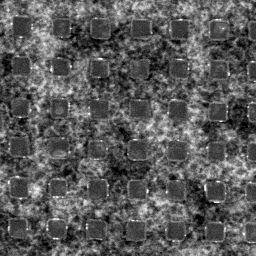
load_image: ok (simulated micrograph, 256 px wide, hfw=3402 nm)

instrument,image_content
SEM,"a regular array of raised bodies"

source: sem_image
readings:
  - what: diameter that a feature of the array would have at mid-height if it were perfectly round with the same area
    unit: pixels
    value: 21.2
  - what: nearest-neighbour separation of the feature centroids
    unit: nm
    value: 517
